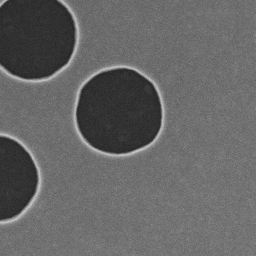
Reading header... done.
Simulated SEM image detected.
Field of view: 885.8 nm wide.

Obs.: holes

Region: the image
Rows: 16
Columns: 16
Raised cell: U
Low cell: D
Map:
DDDDUUUUUUUUUUUU
DDDDDUUUUUUUUUUU
DDDDDUUUUUUUUUUU
DDDDUUUUUUUUUUUU
UDDDUUDDDUUUUUUU
UUUUUDDDDDUUUUUU
UUUUUDDDDDUUUUUU
UUUUUDDDDDUUUUUU
UUUUUDDDDDUUUUUU
DDUUUUUDUUUUUUUU
DDUUUUUUUUUUUUUU
DDUUUUUUUUUUUUUU
DDUUUUUUUUUUUUUU
DUUUUUUUUUUUUUUU
UUUUUUUUUUUUUUUU
UUUUUUUUUUUUUUUU